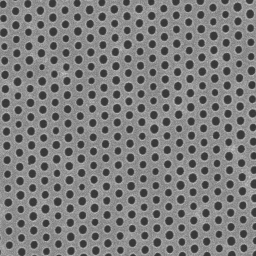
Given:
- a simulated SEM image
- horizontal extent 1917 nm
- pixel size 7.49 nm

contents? a regular array of holes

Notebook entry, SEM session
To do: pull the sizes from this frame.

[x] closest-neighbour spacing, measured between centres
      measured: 105 nm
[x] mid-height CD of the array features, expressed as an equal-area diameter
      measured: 57.3 nanometers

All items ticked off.